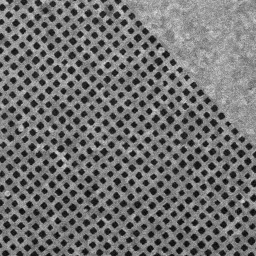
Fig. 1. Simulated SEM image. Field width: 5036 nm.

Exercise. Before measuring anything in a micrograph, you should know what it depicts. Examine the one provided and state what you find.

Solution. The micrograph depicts a regular array of holes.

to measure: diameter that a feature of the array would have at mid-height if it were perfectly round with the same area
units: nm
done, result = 139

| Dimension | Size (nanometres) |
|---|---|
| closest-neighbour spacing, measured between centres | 196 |